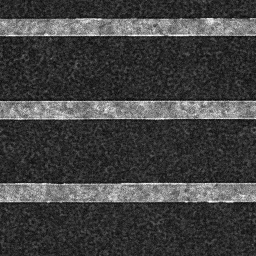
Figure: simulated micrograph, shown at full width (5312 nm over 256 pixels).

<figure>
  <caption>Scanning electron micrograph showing one or a few lines or trenches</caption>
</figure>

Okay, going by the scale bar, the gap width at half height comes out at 1360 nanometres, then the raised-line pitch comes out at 1720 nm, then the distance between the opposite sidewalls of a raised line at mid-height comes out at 371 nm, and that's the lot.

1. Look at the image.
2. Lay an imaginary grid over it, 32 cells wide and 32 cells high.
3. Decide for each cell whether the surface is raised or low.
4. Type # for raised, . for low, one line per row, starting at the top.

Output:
................................
................................
################################
################################
................................
................................
................................
................................
................................
................................
................................
................................
................................
################################
################################
................................
................................
................................
................................
................................
................................
................................
................................
################################
################################
................................
................................
................................
................................
................................
................................
................................